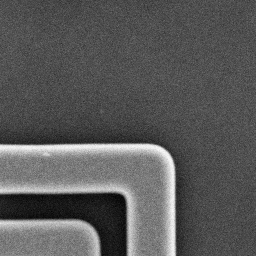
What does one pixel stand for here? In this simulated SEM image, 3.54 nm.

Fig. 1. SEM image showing groups of lines, slits or small figures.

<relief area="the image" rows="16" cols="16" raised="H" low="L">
LLLLLLLLLLLLLLLL
LLLLLLLLLLLLLLLL
LLLLLLLLLLLLLLLL
LLLLLLLLLLLLLLLL
LLLLLLLLLLLLLLLL
LLLLLLLLLLLLLLLL
LLLLLLLLLLLLLLLL
LLLLLLLLLLLLLLLL
LLLLLLLLLLLLLLLL
HHHHHHHHHHLLLLLL
HHHHHHHHHHHLLLLL
HHHHHHHHHHHLLLLL
LLLLLLLLHHHLLLLL
LLLLLLLLHHHLLLLL
HHHHHHLLHHHLLLLL
HHHHHHLLHHHLLLLL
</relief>